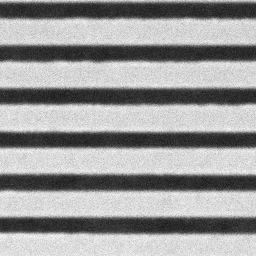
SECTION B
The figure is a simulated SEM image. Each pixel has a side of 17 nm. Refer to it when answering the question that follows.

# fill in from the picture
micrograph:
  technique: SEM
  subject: lines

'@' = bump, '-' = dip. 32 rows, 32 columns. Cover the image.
--------------------------------
--------------------------------
@@@@----@@@@@@@@@@@@@@@@@-@-@-@@
@@@@@@@@@@@@@@@@@@@@@@@@@@@@@@@@
@@@@@@@@@@@@@@@@@@@@@@@@@@@@@@@@
@@@@@@@@@@@@@@@@@@@@@@@@@@@@@@@@
--------------------------------
--------------------------------
@@@@@@@@@@@@@@@@@@@@@@@@@@@@@@@@
@@@@@@@@@@@@@@@@@@@@@@@@@@@@@@@@
@@@@@@@@@@@@@@@@@@@@@@@@@@@@@@@@
--------------------------------
--------------------------------
@@@@@@@@@@@@@@@@@@@@@@@@@@@@@@@@
@@@@@@@@@@@@@@@@@@@@@@@@@@@@@@@@
@@@@@@@@@@@@@@@@@@@@@@@@@@@@@@@@
--------------------------------
--------------------------------
--------------------------------
@@@@@@@@@@@@@@@@@@@@@@@@@@@@@@@@
@@@@@@@@@@@@@@@@@@@@@@@@@@@@@@@@
@@@@@@@@@@@@@@@@@@@@@@@@@@@@@@@@
--------------------------------
--------------------------------
@@@@@@@@@@@@@@@@@@@@@@@@@@@@@@@@
@@@@@@@@@@@@@@@@@@@@@@@@@@@@@@@@
@@@@@@@@@@@@@@@@@@@@@@@@@@@@@@@@
--------------------------------
--------------------------------
@@@@@@@@@@@@@@@@@@@@@@@@@@@@@@@@
@@@@@@@@@@@@@@@@@@@@@@@@@@@@@@@@
@@@@@@@@@@@@@@@@@@@@@@@@@@@@@@@@